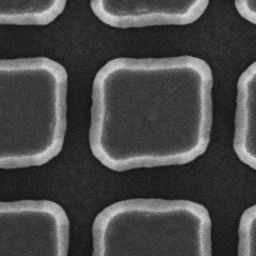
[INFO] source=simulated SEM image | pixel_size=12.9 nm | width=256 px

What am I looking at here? raised bodies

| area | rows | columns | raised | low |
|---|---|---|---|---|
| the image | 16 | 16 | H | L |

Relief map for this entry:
HHHHLLHHHHHHLLLH
LLLLLLLLLLLLLLLL
LLLLLLLLLLLLLLLL
LLLLLLLLLLLLLLLL
HHHHLLLHHHHHHLLL
HHHHLLHHHHHHHLLH
HHHHLLHHHHHHHLLH
HHHHLLHHHHHHHLLH
HHHHLLHHHHHHHLLH
HHHLLLHHHHHHLLLH
LLLLLLLLLLLLLLLL
LLLLLLLLLLLLLLLL
LLLLLLLLLLLLLLLL
HHHHLLLHHHHHHLLL
HHHHLLHHHHHHHLLH
HHHHLLHHHHHHHLLH